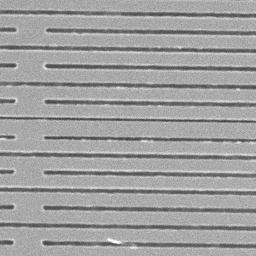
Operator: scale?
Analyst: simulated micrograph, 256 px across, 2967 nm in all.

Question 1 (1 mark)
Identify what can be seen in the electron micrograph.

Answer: parallel lines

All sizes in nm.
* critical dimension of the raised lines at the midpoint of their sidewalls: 148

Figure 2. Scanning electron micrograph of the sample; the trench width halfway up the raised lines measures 56.5 nm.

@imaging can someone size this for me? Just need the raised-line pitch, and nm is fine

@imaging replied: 206